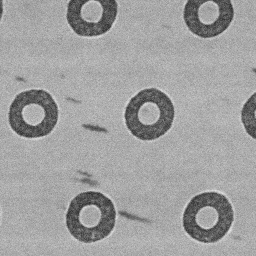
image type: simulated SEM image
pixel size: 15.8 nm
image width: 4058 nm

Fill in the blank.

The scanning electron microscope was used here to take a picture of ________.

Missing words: ring-shaped grooves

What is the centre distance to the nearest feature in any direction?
1860 nm